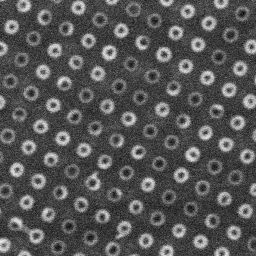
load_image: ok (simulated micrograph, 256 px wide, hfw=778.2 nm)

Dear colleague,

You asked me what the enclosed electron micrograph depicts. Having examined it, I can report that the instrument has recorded a regular array of raised bodies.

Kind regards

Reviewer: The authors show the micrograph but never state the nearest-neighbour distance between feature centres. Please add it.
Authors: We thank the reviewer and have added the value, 24.1 px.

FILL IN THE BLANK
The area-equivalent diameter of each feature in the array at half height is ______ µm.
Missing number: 0.0402